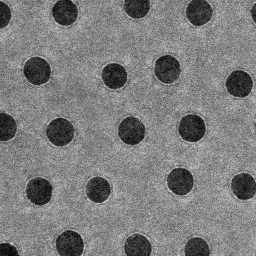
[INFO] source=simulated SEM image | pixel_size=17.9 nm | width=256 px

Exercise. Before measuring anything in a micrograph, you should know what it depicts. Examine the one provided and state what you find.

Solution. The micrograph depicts a regular array of raised bodies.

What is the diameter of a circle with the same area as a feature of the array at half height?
516 nm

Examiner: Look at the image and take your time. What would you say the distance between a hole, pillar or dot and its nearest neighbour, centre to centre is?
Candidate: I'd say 1050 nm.